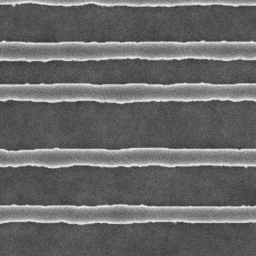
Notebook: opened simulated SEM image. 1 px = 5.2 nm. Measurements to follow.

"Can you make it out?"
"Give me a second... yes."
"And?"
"lines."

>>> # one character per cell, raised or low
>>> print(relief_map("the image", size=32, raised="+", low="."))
......+++++.++++++++++++.+..++++
................................
................................
................................
................................
++++++++++++++++++++++++++++++++
++++++++++++++++++++++++++++++++
+++++++.+++.................+...
................................
................................
.......................+.+......
++++++++++++++++++++++++++++++++
++++++++++++++++++++++++++++++++
................................
................................
................................
................................
................................
................................
++++++++++++++++++++++++++++++++
++++++++++++++++++++++++++++++++
................................
................................
................................
................................
................................
++++++++++++++++++++++++++++++++
++++++++++++++++++++++++++++++++
................................
................................
................................
................................